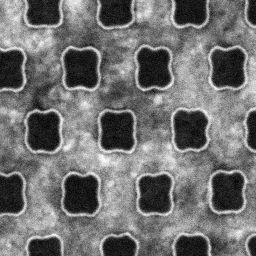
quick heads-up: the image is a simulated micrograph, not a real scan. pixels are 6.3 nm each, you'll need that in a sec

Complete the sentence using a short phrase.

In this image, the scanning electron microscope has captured a regular array of raised bodies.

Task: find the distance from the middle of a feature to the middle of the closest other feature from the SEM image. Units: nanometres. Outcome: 454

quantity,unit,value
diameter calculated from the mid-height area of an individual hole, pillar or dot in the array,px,43.1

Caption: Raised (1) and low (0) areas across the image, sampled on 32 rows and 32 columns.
00011111000011111000001111000001
00011111000011111100001111000001
00011111000011111000001111000001
00000000000001000000000000000000
00000000000000000000000000000000
00000000000000000000000000000000
11100000111100000111100000111110
11100000111100000111100000111110
11100000111100000111100000111110
11100000111110000111110000111110
11100000111100000111100000111110
00000000000000000000000000000000
00000000000000000000000000000000
00000000000000000000000000000000
00011111000011111000001111000001
00011111000011111000001111000001
00011111000011111000001111000001
00011111000011111000001111000001
00001110000001111000001110000001
00000000000000000000000000000000
00000000000000000000000000000000
00000000000000000000000000010100
11100000111100000111110000111110
11100000111100000111110000111110
11100000111100000111100000111110
11100000111110000111110000111110
11100000111100000011100000011100
00000000000000000000000000000000
00000000000000000000000000000000
00000010000001110000001111000001
00011111000001111000001111000001
00011111000001111000001111000001